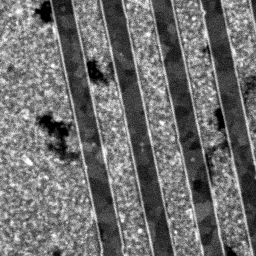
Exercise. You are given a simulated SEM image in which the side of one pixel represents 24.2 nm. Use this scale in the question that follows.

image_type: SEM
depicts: parallel lines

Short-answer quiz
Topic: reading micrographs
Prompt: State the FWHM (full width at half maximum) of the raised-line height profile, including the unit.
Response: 511 nm